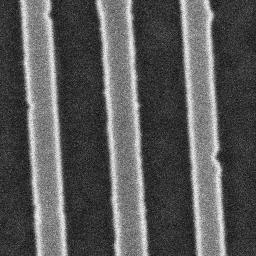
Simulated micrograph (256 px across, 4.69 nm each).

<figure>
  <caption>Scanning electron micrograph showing one or a few lines or trenches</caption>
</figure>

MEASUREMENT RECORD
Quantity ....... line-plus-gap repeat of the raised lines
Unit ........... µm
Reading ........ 0.373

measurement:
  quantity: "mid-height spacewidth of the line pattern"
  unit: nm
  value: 248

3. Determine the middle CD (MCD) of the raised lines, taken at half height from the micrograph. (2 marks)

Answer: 126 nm